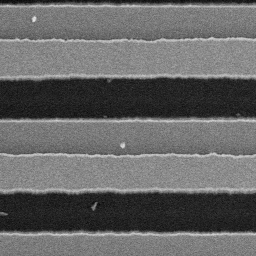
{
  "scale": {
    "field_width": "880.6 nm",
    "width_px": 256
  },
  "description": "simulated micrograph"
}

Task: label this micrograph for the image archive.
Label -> lines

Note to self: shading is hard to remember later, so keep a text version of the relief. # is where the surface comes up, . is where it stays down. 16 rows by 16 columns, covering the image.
################
################
################
################
################
................
................
................
################
################
################
################
................
................
................
################